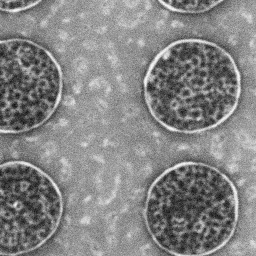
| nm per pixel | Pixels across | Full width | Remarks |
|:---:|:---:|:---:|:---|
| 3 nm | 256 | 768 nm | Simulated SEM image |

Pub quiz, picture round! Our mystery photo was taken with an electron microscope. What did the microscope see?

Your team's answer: raised bodies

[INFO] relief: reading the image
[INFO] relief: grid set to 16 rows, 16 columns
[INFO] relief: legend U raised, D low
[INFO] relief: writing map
UUDDDDDDDDDUUDDD
DDDDDDDDDDDDDDDD
DUDDDDDDDDDDDDDD
UUUDDDDDDDUUUUDD
UUUUDDDDDUUUUUUD
UUUUDDDDDUUUUUUD
UUUUDDDDDUUUUUUD
UUUDDDDDDDUUUUDD
DDDDDDDDDDDDDDDD
DDDDDDDDDDDDDDDD
UUDDDDDDDDDUUDDD
UUUDDDDDDDUUUUDD
UUUUDDDDDUUUUUUD
UUUUDDDDDUUUUUUD
UUUDDDDDDUUUUUUD
UUDDDDDDDDUUUUDD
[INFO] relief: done